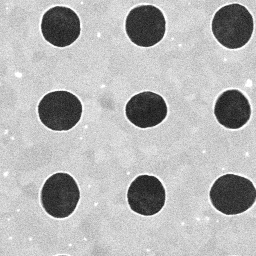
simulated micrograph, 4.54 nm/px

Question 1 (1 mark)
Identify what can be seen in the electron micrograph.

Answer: a regular array of holes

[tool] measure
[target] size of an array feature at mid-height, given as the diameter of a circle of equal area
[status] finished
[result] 187 nm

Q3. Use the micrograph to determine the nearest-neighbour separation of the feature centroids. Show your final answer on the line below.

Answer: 382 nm